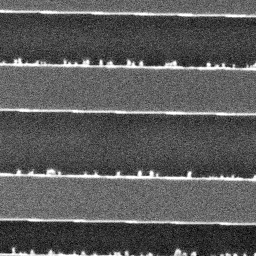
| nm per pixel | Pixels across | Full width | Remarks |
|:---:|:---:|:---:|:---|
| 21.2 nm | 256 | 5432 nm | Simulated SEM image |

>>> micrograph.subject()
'lines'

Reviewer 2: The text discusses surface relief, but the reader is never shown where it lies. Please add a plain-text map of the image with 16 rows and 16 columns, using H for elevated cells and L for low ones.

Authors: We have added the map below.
HHHHHHHHHHHHHHHH
LLLLLLLLLLLLLLLL
LLLLLLLLLLLLLLLL
LLLLLLLLLLLLLLLL
HHHHHHHHHHHHHHHH
HHHHHHHHHHHHHHHH
HHHHHHHHHHHHHHHH
LLLLLLLLLLLLLLLL
LLLLLLLLLLLLLLLL
LLLLLLLLLLLLLLLL
LLLLLLLLLLLLLLLL
HHHHHHHHHHHHHHHH
HHHHHHHHHHHHHHHH
HHHHHHHHHHHHHHHH
LLLLLLLLLLLLLLLL
LLLLLLLLLLLLLLLL